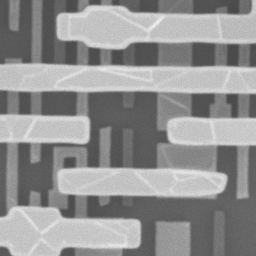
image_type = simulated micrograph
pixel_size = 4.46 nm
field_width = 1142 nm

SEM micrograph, wiring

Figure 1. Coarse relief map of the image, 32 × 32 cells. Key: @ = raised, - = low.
--------------------------------
----------@@@@@@---------------@
-------@@@@@@@@@@@@@@@@@@@@@@@@@
-------@@@@@@@@@@@@@@@@@@@@@@@@@
-------@@@@@@@@@@@@@@@@@@@@@@@@@
-----------@@@@@----------------
--------------------------------
--------------------------------
@@@@@@@@@@@@@@@@@@@@@@@@@@@@@@@@
@@@@@@@@@@@@@@@@@@@@@@@@@@@@@@@@
@@@@@@@@@@@@@@@@@@@@@@@@@@@@@@@@
----------------------@@@@@@@@@@
--------------------------------
--------------------------------
@@@@----------------------------
@@@@@@@@@@@----------@@@@@@@@@@@
@@@@@@@@@@@----------@@@@@@@@@@@
@@@@@@@@@@@----------@@@@@@@@@@@
--------------------------------
--------------------------------
--------------------------------
-------@@@@@@@@@@@@@@@@@@@------
-------@@@@@@@@@@@@@@@@@@@@@----
-------@@@@@@@@@@@@@@@@@@@@@----
--------------------------------
--------------------------------
-@@@@@@-------------------------
@@@@@@@@@@@@@@-@@---------------
@@@@@@@@@@@@@@@@@@--------------
@@@@@@@@@@@@@@@@@---------------
@@@@@@@@@@@@@@@@@---------------
-@@@@@@@------------------------